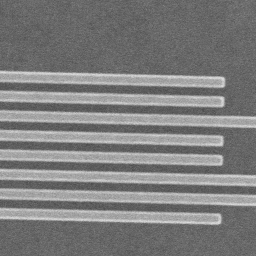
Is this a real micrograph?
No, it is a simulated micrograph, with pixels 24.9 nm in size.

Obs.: groups of lines, slits or small figures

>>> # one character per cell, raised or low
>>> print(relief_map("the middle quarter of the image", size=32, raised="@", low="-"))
--------------------------------
--------------------------------
@@------------------------------
@@@@@@@@@@@@@@@@@@@@@@@@@@@@@@@@
@@@@@@@@@@@@@@@@@@@@@@@@@@@@@@@@
--------------------------------
--------------------------------
@-------------------------------
@@@@@@@@@@@@@@@@@@@@@@@@@@@@@@@@
--@@@@@@@@@@@@@@@@@@@@@@@@@@@@@@
--------------------------------
--------------------------------
@@@@@@@@@-----------------------
@@@@@@@@@@@@@@@@@@@@@@@@@@@@@@@@
---------@@@@@@@@@@@@@@@@@@@@@@@
--------------------------------
--------------------------------
@@@@@@@@------------------------
@@@@@@@@@@@@@@@@@@@@@@@@@@@@@@@@
--------@@@@@@@@@@@@@@@@@@@@@@@@
--------------------------------
--------------------------------
@@@@@@@@@@@@@@@-----------------
@@@@@@@@@@@@@@@@@@@@@@@@@@@@@@@@
----------------@@@@@@@@@@@@@@@@
--------------------------------
--------------------------------
@@@@@@@@@@@@@@@@@@@@@@@---------
@@@@@@@@@@@@@@@@@@@@@@@@@@@@@@@@
--------------@@@@@@@@@@@@@@@@@@
--------------------------------
--------------------------------